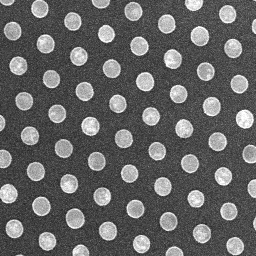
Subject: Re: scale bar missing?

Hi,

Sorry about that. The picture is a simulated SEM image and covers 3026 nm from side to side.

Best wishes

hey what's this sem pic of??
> a regular array of raised bodies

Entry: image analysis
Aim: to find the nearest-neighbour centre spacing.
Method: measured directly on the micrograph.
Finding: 415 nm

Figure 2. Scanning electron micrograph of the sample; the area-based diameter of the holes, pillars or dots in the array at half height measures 207 nanometers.